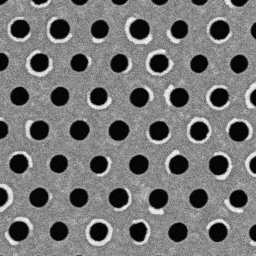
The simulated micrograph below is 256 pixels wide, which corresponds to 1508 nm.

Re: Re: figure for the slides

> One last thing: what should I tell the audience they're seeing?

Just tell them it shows a regular array of holes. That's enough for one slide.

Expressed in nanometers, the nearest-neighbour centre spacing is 229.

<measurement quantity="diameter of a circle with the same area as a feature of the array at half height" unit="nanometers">112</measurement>